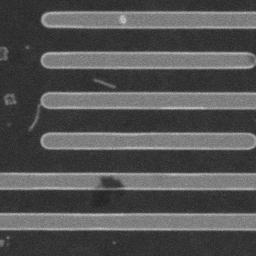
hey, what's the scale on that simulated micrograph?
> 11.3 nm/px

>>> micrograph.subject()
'groups of lines, slits or small figures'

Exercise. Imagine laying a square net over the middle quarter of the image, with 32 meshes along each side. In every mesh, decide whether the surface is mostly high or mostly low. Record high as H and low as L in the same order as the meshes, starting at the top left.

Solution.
HHHHHHHHHHHHHHHHHHHHHHHHHHHHHHHH
LLLLLLLLLLLLLLLLLLLLLLLLLLLLLLLL
LLLLLLLLLLLLLLLLLLLLLLLLLLLLLLLL
LLLLLLLLLLLLLLLLLLLLLLLLLLLLLLLL
LLLLLLLLLLLLLLLLLLLLLLLLLLLLLLLL
LLLLLLLLLLLLLLLLLLLLLLLLLLLLLLLL
LLLLLLLLLLLLLLLLLLLLLLLLLLLLLLLL
HHHHHHHHHHHHHHHHHHHHHHHHHHHHHHHH
HHHHHHHHHHHHHHHHHHHHHHHHHHHHHHHH
HHHHHHHHHHHHHHHHHHHHHHHHHHHHHHHH
HHHHHHHHHHHHHHHHHHHHHHHHHHHHHHHH
LLLLLLLLLLLLLLLLLLLLLLLLLLLLLLLL
LLLLLLLLLLLLLLLLLLLLLLLLLLLLLLLL
LLLLLLLLLLLLLLLLLLLLLLLLLLLLLLLL
LLLLLLLLLLLLLLLLLLLLLLLLLLLLLLLL
LLLLLLLLLLLLLLLLLLLLLLLLLLLLLLLL
LLLLLLLLLLLLLLLLLLLLLLLLLLLLLLLL
HHHHHHHHHHHHHLLLLLLLHHHHHHHHHHHH
HHHHHHHHHHHHHHHHHHHHHHHHHHHHHHHH
HHHHHHHHHHHHHHHHHHHHHHHHHHHHHHHH
HHHHHHHHHHHHHHHHHHHHHHHHHHHHHHHH
LLLLLLLLLLLLLLLLLLLLLLLLLLLLLLLL
LLLLLLLLLLLLLLLLLLLLLLLLLLLLLLLL
LLLLLLLLLLLLLLLLLLLLLLLLLLLLLLLL
LLLLLLLLLLLLLLLLLLLLLLLLLLLLLLLL
LLLLLLLLLLLLLLLLLLLLLLLLLLLLLLLL
LLLLLLLLLLLLLLLLLLLLLLLLLLLLLLLL
HHHHHHHHHHHHHHHHHHHHHHHHHHLLLLLL
HHHHHHHHHHHHHHHHHHHHHHHHHHHHHHHH
HHHHHHHHHHHHHHHHHHHHHHHHHHHHHHHH
HHHHHHHHHHHHHHHHHHHHHHHHHHHHHHHH
LLLLLLLLLLLLLLLLLLLLLLLLLLLLLLLL